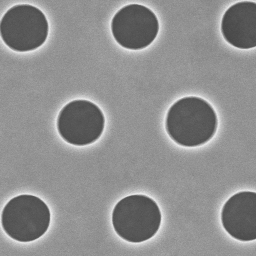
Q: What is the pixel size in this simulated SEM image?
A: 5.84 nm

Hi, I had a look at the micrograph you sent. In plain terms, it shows holes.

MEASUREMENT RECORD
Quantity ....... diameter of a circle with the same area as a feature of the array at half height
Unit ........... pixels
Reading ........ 47.6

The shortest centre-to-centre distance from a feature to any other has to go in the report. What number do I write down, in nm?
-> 643